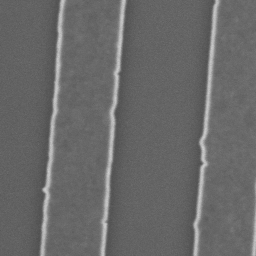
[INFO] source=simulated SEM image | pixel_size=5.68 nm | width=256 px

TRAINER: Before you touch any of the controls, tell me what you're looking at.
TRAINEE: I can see one or a few lines or trenches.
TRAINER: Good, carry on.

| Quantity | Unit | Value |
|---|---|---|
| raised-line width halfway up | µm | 0.346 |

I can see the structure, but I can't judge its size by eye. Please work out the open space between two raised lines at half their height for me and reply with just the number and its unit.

520 nanometers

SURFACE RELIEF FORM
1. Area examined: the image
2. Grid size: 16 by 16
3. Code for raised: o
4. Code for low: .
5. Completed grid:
....oooo.....ooo
....oooo.....ooo
....oooo.....ooo
....ooo......ooo
....ooo......ooo
....ooo......ooo
...oooo......ooo
...oooo......ooo
...oooo......ooo
...oooo......ooo
...oooo......ooo
...oooo......ooo
...oooo.....oooo
...oooo.....oooo
...oooo.....oooo
...ooo......oooo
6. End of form